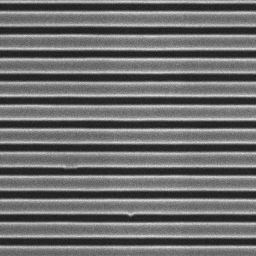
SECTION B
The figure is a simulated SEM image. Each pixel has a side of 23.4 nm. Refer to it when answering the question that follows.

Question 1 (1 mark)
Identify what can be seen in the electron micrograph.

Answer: parallel lines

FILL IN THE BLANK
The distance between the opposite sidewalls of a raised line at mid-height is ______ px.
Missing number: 15.3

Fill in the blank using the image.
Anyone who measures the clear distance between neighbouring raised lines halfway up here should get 202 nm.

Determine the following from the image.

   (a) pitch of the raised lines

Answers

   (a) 550 nm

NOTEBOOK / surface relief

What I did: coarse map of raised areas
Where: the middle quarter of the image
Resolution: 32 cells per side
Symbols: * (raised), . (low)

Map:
********************************
********************************
................................
................................
................................
********************************
********************************
********************************
................................
................................
**************..................
********************************
********************************
********************************
................................
................................
********************************
********************************
********************************
********************************
................................
................................
********************************
********************************
********************************
********************************
................................
................................
********************************
********************************
********************************
....******......................